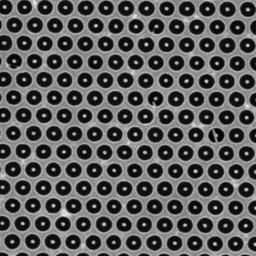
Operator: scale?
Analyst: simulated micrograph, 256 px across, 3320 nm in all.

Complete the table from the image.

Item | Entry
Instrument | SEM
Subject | a regular array of ring-shaped grooves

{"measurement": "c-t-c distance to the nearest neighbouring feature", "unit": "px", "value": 20.2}